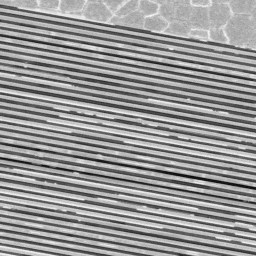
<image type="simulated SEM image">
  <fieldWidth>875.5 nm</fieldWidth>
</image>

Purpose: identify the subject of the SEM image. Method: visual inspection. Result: parallel lines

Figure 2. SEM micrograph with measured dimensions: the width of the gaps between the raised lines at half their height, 11.7 nanometres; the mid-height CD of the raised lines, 12.3 nm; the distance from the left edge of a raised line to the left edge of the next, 24.3 nm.